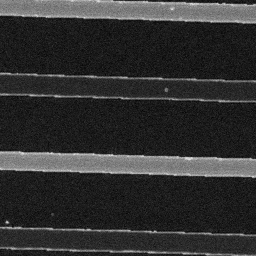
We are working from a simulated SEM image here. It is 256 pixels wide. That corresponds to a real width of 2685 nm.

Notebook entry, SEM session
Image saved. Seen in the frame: lines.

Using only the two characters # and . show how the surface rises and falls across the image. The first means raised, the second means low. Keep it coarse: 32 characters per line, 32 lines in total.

####################............
################################
.........................#######
................................
................................
................................
................................
................................
................................
########........................
################################
################################
.........................#######
................................
................................
................................
................................
................................
................................
############....................
################################
................################
................................
................................
................................
................................
................................
................................
###.............................
################################
################################
..................##############